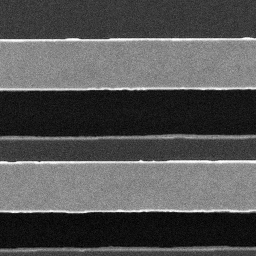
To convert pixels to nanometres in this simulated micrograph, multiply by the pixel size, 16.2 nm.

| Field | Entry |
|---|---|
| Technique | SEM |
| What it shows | lines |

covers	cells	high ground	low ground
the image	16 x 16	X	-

XXXXXXXXXXXXXXXX
XXXXXXXXXXXXXXXX
XXXXXXXXXXXXXXXX
XXXXXXXXXXXXXXXX
XXXXXXXXXXXXXXXX
XXXXXXXXXXXXXXXX
----------------
----------------
----------------
XXXXXXXXXXXXXXXX
XXXXXXXXXXXXXXXX
XXXXXXXXXXXXXXXX
XXXXXXXXXXXXXXXX
----------------
----------------
----------------